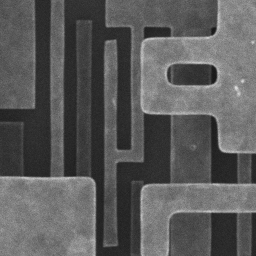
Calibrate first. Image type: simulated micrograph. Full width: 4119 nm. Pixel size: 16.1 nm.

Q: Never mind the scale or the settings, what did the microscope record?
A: wiring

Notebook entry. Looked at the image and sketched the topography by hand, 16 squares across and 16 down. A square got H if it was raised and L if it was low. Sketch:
LLLLLLLLLLLLLLHH
LLLLLLLLLLLLLLHH
LLLLLLLLLHHHHHHH
LLLLLLLLLHHHHHHH
LLLLLLLLLHHLLHHH
LLLLLLLLLHHHHHHH
LLLLLLLLLHHHHHHH
LLLLLLLLLLLLLHHH
LLLLLLLLLLLLLLHH
LLLLLLLLLLLLLLHH
LLLLLLLLLLLLLLLL
HHHHHHLLLHHHHHHH
HHHHHHLLLHHHHHHH
HHHHHHLLLHHLLLLL
HHHHHHLLLHHLLLLL
HHHHHHLLLHHLLLLL